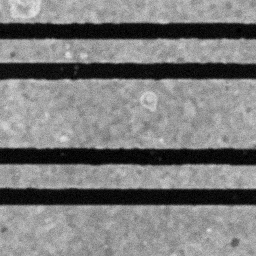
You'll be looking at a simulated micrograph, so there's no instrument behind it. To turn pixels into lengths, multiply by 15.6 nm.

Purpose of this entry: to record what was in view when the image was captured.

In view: lines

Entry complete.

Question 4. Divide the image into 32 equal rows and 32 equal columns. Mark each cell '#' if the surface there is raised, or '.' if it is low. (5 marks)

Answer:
################################
################################
################################
................................
................................
################################
################################
################################
................................
................................
################################
################################
################################
################################
################################
################################
################################
################################
....###.....################.###
................................
................................
################################
################################
................................
................................
................................
################################
################################
################################
################################
################################
################################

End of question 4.